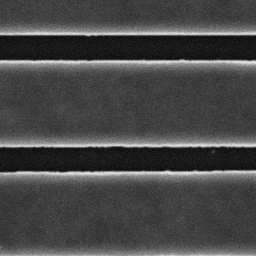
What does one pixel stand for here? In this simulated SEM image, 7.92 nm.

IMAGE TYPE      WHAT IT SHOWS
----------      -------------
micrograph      lines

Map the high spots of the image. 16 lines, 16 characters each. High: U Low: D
UUUUUUUUUUUUUUUU
UUUUUUUUUUUUUUUU
DDDDDDDDDDDDDDDD
DDDDDDDDDDDDDDDD
UUUUUUUUUUUUUUUU
UUUUUUUUUUUUUUUU
UUUUUUUUUUUUUUUU
UUUUUUUUUUUUUUUU
UUUUUUUUUUUUUUUU
DDDDDDDDDDDDDDDD
DDDDDDDDDDDDDDDD
UUUUUUUUUUUUUUUU
UUUUUUUUUUUUUUUU
UUUUUUUUUUUUUUUU
UUUUUUUUUUUUUUUU
UUUUUUUUUUUUUUUU